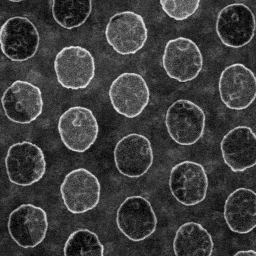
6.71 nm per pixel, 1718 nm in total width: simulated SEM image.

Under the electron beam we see a regular array of raised bodies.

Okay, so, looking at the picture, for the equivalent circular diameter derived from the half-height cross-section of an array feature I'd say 277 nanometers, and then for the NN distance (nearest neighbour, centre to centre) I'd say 412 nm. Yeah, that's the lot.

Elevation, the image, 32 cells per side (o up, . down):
.......oooo.........ooooo.......
.......oooo..........ooo....ooo.
.ooo...oooo...oooo.........ooooo
oooo.........ooooo.........ooooo
ooooo........ooooo.........ooooo
ooooo.........oooo...ooo....ooo.
oooo....ooo....oo....oooo.......
..o....ooooo........ooooo.......
.......ooooo.........oooo...ooo.
.......ooooo...oo....ooo....oooo
..oo....ooo...oooo.........ooooo
.oooo.........ooooo........ooooo
ooooo.........oooo..........oooo
ooooo....o....oooo...oooo....o..
.oooo...oooo....o....ooooo......
.......ooooo.........oooo.......
.......ooooo.........oooo....ooo
........oooo...ooo....ooo...oooo
.oooo....oo...ooooo.........oooo
.oooo.........ooooo.........oooo
.ooooo.........oooo....oo...oooo
.oooo....oo....ooo...ooooo......
.oooo...oooo.........ooooo......
........oooo.........ooooo......
........oooo..........oooo...ooo
........oooo...oooo....o....oooo
..ooo....o.....oooo.........oooo
.ooooo.........ooooo........oooo
.ooooo.........oooo....oo....ooo
.ooooo...ooo....ooo...oooo......
..ooo...ooooo.........ooooo.....
........ooooo.........oooo....oo